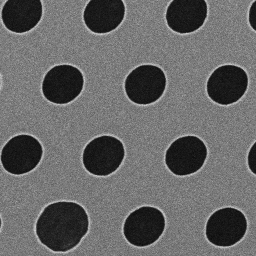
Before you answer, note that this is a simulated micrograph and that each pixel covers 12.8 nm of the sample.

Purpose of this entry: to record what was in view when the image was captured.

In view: a regular array of holes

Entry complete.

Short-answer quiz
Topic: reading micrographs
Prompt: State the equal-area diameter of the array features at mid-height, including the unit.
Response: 514 nm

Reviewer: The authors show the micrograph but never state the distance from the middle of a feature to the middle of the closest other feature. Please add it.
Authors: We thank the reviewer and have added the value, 1040 nm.